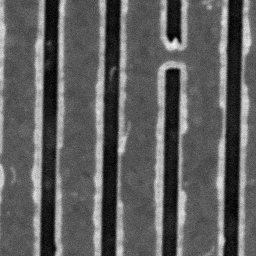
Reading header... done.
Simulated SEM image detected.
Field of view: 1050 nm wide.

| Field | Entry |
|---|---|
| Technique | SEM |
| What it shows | one or a few lines or trenches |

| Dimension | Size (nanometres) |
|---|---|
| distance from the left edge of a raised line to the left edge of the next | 251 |